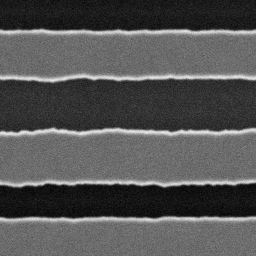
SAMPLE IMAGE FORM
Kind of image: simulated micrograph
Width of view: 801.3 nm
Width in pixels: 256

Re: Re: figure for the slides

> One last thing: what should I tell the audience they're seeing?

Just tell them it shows lines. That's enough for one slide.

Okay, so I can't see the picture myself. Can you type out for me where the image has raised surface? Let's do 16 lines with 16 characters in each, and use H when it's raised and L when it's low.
LLLLLLLLLLLLLLLL
LLLLLLLLLLLLLLLL
HHHHHHHHHHHHHHHH
HHHHHHHHHHHHHHHH
HHHHHHHHHHHHHHHH
LLLLLLLLLLLLLLLL
LLLLLLLLLLLLLLLL
LLLLLLLLLLLLLLLL
HHHHHHHHHHHHHHHH
HHHHHHHHHHHHHHHH
HHHHHHHHHHHHHHHH
HHHLHLHLHHHHHHHL
LLLLLLLLLLLLLLLL
LLLLLLLLLLLLLLLL
HHHHHHHHHHHHHHHH
HHHHHHHHHHHHHHHH